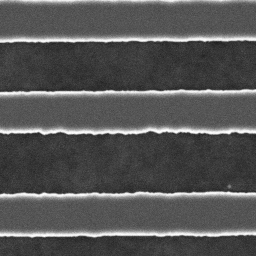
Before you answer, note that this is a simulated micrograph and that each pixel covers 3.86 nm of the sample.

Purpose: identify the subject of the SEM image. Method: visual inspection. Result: lines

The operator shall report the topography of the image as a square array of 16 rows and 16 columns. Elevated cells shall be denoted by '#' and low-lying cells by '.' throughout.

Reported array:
################
################
################
................
................
................
################
################
................
................
................
................
################
################
################
................